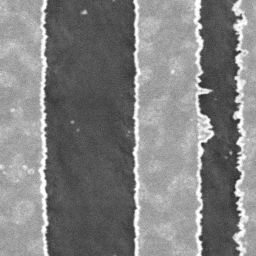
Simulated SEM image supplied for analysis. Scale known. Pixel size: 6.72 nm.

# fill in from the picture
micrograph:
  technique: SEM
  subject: one or a few lines or trenches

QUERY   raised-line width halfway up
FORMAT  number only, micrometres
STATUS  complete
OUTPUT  0.426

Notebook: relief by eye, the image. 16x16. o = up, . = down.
ooo.....oooo...o
ooo.....oooo...o
ooo.....ooooo..o
ooo.....oooo...o
ooo......ooo...o
ooo......oooo..o
ooo......ooo...o
ooo......oooo..o
ooo......oooo..o
ooo.....ooooo..o
ooo......ooo...o
ooo......ooo...o
ooo......ooo...o
ooo......ooo...o
ooo......ooo...o
ooo.....oooo...o